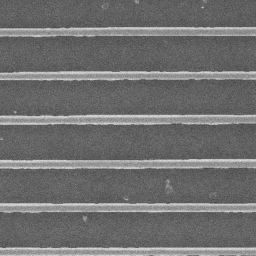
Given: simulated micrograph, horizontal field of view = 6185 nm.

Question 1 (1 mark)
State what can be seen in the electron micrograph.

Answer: lines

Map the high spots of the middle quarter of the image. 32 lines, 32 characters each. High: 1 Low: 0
00000000000000000000000000000000
00000000000000000000000000000000
11111111111111111111111111111111
11111111111111111111111111111111
00000000000000000000000000000000
00000000000000000000000000000000
00000000000000000000000000000000
00000000000000000000000000000000
00000000000000000000000000000000
00000000000000000000000000000000
00000000000000000000000000000000
00000000000000000000000000000000
00000000000000000000000000000000
11111111111111111111111111111111
11111111111111111111111111111111
00000000000000000000000000000000
00000000000000000000000000000000
00000000000000000000000000000000
00000000000000000000000000000000
00000000000000000000000000000000
00000000000000000000000000000000
00000000000000000000000000000000
00000000000000000000000000000000
00000000000000000000000000000000
11111111111111111111111111111111
11111111111111111111111111111111
00000000000000000000000000000000
00000000000000000000000000000000
00000000000000000000000000000000
00000000000000000000000000000000
00000000000000000000000000000000
00000000000000000000000000000000